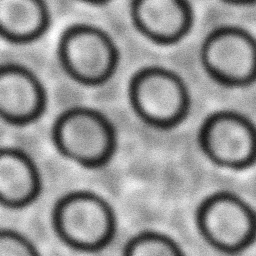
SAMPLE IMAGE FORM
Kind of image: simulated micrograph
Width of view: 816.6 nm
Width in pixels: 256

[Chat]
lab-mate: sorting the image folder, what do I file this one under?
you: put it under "ring-shaped grooves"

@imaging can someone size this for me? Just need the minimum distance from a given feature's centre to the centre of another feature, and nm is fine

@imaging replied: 264